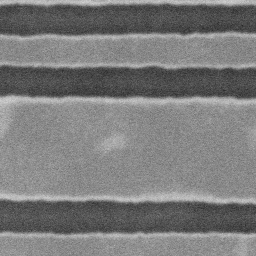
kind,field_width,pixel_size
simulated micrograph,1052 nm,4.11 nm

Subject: lines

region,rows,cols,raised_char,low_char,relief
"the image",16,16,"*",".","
................
................
****************
****************
................
................
****************
****************
****************
****************
****************
****************
....*..***..****
................
................
****************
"